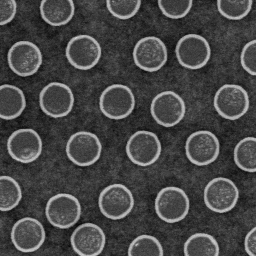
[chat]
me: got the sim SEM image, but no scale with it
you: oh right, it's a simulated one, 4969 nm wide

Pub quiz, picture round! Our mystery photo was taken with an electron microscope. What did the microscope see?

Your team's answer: a regular array of raised bodies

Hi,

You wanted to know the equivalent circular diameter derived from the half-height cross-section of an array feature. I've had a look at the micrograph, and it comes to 624 nanometers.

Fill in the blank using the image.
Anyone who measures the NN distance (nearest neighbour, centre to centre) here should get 985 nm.